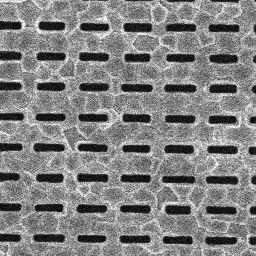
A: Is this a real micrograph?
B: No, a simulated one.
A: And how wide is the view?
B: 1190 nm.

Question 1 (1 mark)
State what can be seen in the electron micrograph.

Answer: a regular array of holes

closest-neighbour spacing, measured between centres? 0.139 µm